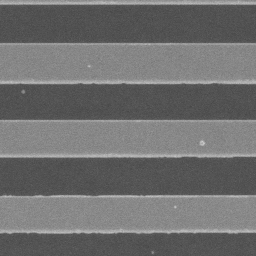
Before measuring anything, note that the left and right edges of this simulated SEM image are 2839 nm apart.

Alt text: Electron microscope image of lines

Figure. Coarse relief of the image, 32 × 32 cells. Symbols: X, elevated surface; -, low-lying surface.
--------------------------------
--------------------------------
--------------------------------
--------------------------------
--------------------------------
XXXXXXXXXXXXXXXXXXXXXXXXXXXXXXXX
XXXXXXXXXXXXXXXXXXXXXXXXXXXXXXXX
XXXXXXXXXXXXXXXXXXXXXXXXXXXXXXXX
XXXXXXXXXXXXXXXXXXXXXXXXXXXXXXXX
XXXXXXXXXXXXXXXXXXXXXXXXXXXXXXXX
--------------------------------
--------------------------------
--------------------------------
--------------------------------
--------------------------------
XXXXXXXXXXXXXXXXXXXXXXXXXXXXXXXX
XXXXXXXXXXXXXXXXXXXXXXXXXXXXXXXX
XXXXXXXXXXXXXXXXXXXXXXXXXXXXXXXX
XXXXXXXXXXXXXXXXXXXXXXXXXXXXXXXX
XXXXXXXXXXXXXXXXXXXXXXXXXXXXXXXX
--------------------------------
--------------------------------
--------------------------------
--------------------------------
XX--XXXXXXXXXXXXXXXXXXXXXXXXXXXX
XXXXXXXXXXXXXXXXXXXXXXXXXXXXXXXX
XXXXXXXXXXXXXXXXXXXXXXXXXXXXXXXX
XXXXXXXXXXXXXXXXXXXXXXXXXXXXXXXX
XXXXXXXXXXXXXXXXXXXXXXXXXXXXXXXX
--------------------------------
--------------------------------
--------------------------------